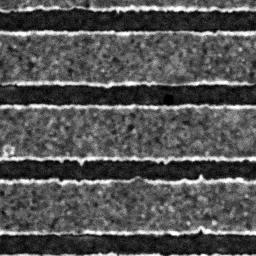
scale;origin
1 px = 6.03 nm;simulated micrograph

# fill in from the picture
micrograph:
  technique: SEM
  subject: one or a few lines or trenches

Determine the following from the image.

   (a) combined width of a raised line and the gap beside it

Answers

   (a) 74.4 pixels